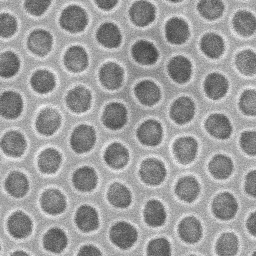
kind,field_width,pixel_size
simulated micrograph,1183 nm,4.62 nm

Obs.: a regular array of holes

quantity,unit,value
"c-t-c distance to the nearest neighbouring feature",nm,179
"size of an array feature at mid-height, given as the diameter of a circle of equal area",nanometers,131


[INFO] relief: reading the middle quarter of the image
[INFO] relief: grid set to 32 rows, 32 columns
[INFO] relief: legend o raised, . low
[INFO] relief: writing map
......ooo......ooooo..oooo......
.....oooo......ooooooooooo......
oooooooo.......ooooooooooo......
oooooooo.......oooooooooooo.....
ooooooooo......ooo.....ooooo...o
ooo..oooo.....ooo.......oooooooo
o.....ooooo..oooo.......oooooooo
o......oooooooooo.......oooooooo
.......ooooooooooo......oooo....
.......ooooo..ooooo.....ooo.....
o......ooo.....ooooo..oooo......
o.....oooo......oooooooooo......
ooo..oooo.......oooooooooo......
ooooooooo.......oooooooooo......
ooooooooo.......ooo.....ooo.....
ooo....ooo.....ooo.......ooooooo
oo......ooo..ooooo.......ooooooo
oo......oooooooooo.......ooooooo
o.......oooooooooo.......ooo....
o.......oooo..ooooo......oo.....
oo......oo.....ooooo...oooo.....
oo.....ooo......ooooooooooo.....
ooo...oooo......ooooooooooo.....
oooooooooo......oooo....ooo.....
oooooooooo......ooo......ooo....
ooooo.ooooo.....ooo.......oooooo
ooo.....oooo..ooooo.......oooooo
oo......oooooooooo........oooo..
oo.......oooooooooo......ooo....
oo.......ooo..oooooo.....ooo....
oo......ooo....oooooo..oooo.....
ooo.....ooo.....ooooooooooo.....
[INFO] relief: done